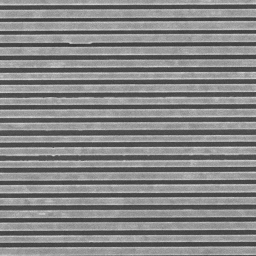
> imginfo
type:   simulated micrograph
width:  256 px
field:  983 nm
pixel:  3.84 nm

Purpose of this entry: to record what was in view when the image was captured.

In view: parallel lines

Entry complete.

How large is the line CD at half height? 29.8 nanometers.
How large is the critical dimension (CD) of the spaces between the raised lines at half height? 18.7 nm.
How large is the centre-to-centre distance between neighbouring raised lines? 48 nm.